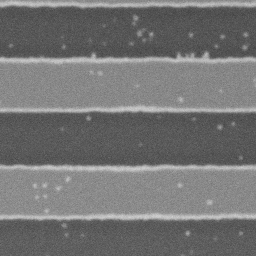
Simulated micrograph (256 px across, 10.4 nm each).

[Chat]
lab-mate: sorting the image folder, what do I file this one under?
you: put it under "lines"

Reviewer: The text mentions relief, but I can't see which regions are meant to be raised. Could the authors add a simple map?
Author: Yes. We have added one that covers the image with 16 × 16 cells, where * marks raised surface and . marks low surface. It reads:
................
................
................
................
****************
****************
****************
................
................
................
****************
****************
****************
****************
................
................